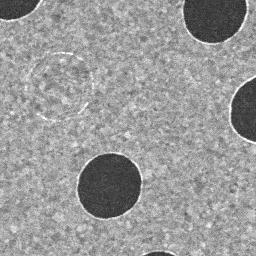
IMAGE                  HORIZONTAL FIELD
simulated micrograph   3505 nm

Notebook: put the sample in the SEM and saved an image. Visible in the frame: holes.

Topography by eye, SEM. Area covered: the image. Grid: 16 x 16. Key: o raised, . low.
..ooooooooo....o
oooooooooooo...o
oooooooooooo..oo
oooooooooooooooo
oooooooooooooooo
ooooooooooooooo.
oooooooooooooo..
oooooooooooooo..
ooooooooooooooo.
oooooooooooooooo
ooooo....ooooooo
ooooo....ooooooo
ooooo....ooooooo
oooooo.ooooooooo
oooooooooooooooo
oooooooooooooooo